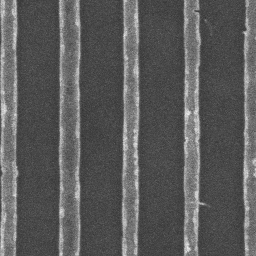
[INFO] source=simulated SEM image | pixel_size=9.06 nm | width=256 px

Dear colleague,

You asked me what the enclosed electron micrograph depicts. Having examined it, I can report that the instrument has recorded parallel lines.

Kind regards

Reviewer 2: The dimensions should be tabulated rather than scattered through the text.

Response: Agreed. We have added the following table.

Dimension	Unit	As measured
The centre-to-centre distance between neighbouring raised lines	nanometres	553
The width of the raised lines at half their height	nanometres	134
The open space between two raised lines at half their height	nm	409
